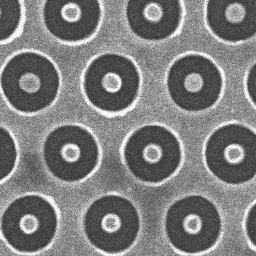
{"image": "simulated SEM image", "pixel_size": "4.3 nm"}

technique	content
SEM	a regular array of ring-shaped grooves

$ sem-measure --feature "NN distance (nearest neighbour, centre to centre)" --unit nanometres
350